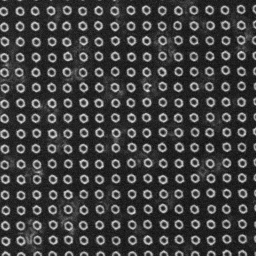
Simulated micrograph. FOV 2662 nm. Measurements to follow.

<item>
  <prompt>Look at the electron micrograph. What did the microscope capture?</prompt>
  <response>a regular array of raised bodies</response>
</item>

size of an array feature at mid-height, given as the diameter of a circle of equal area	0.0813	micrometres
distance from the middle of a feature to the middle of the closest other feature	155	nanometres